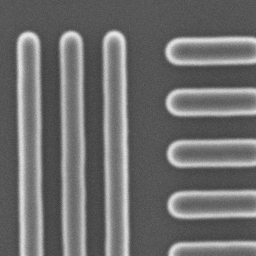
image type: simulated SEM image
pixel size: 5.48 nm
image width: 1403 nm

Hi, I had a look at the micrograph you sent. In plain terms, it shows groups of lines, slits or small figures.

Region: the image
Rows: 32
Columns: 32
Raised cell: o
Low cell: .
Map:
................................
................................
................................
................................
...o....oo....o.................
..ooo...oo...oo......ooooooooooo
..ooo...oo...oo......ooooooooooo
..ooo...oo...oo......ooooooooooo
..ooo...oo...ooo................
..ooo...oo...ooo................
..ooo...oo...ooo................
..ooo...oo...ooo......oooooooooo
..ooo...oo...ooo.....ooooooooooo
..ooo...oo...ooo.....ooooooooooo
..ooo...oo...ooo................
...oo...oo...ooo................
...oo...oo...ooo................
...oo...oo...ooo................
...oo...oo...ooo.....ooooooooooo
...oo...oo...ooo.....ooooooooooo
...oo...oo...ooo......oooooooooo
...oo...oo...ooo................
...oo...oo...ooo................
...oo...oo...ooo................
...oo...oo...ooo......oooooooooo
...oo...oo...ooo.....ooooooooooo
...oo...oo...ooo......oooooooooo
...oo...oo...ooo................
...oo...oo....oo................
...oo...oo....oo................
...oo...oo...ooo..........oooooo
...oo...oo...ooo.....ooooooooooo